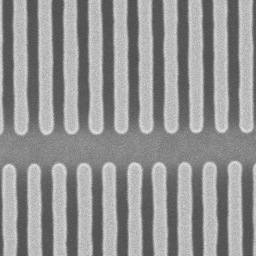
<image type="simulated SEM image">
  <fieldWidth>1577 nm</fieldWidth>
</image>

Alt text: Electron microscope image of groups of lines, slits or small figures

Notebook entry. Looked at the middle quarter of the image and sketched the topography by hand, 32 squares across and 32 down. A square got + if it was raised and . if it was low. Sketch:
+++...+++....+++...+++...+++...+
+++...+++....+++...+++...+++...+
+++...++++...+++...+++...+++...+
+++...++++...+++...+++...+++...+
+++...++++...+++...+++...+++...+
+++...++++...+++...+++...+++...+
+++....++....+++...+++...+++...+
+++....++....+++...+++...+++...+
+++....+++...+++...+++...+++...+
+++....+++...+++...+++...+++...+
+++....+++...+++...+++...+++....
+++...++++...+++...+++...+++....
+++...++++...+++...+++...+++....
+++...++++...+++...+++...+++....
+++...++++...+++...+++...+++....
+++...++++...+++...+++...+++....
.++....+++...+++...+++....++....
................................
................................
................................
................................
................................
................................
................................
................................
....++....+++...+++....++....++.
...++++...+++...+++...+++....+++
...++++...+++...+++...+++....+++
...++++...+++...+++...+++....+++
...++++...+++...+++...+++....+++
...++++...+++...+++...+++....+++
...++++...+++...+++...++++...+++